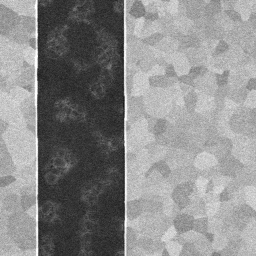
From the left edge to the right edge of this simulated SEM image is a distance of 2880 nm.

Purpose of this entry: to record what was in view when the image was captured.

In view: one or a few lines or trenches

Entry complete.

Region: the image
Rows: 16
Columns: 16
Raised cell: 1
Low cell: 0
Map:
1100000011111111
1100000011111111
1100000011111111
1100000011111111
1100000011111111
1100000011111111
1100000011111111
1100000011111111
1100000011111111
1100000011111111
1100000011111111
1100000011111111
1100000011111111
1100000011111111
1100000011111111
1100000011111111